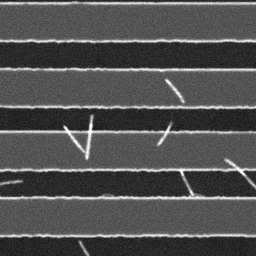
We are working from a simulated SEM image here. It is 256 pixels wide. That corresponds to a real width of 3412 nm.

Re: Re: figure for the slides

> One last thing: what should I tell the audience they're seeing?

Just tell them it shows lines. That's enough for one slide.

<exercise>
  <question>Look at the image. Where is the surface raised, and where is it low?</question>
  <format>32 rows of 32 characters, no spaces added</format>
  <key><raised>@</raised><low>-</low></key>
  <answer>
@@@@@@@@@@@@@@@@@@@@@@@@@@@@@@@@
@@@@@@@@@@@@@@@@@@@@@@@@@@@@@@@@
@@@@@@@@@@@@@@@@@@@@@@@@@@@@@@@@
@@@@@@@@@@@@@@@@@@@@@@@@@@@@@@@@
@@@@@@@@@@@@@@@@@@@@@@@@@@@@@@@@
--------------------------------
--------------------------------
--------------------------------
--------------------------------
@@@@@@@@@@@@@@@@@@@@@@@@@@@@@@@@
@@@@@@@@@@@@@@@@@@@@@@@@@@@@@@@@
@@@@@@@@@@@@@@@@@@@@@@@@@@@@@@@@
@@@@@@@@@@@@@@@@@@@@@@@@@@@@@@@@
--------@---@--@-@@-@@-@@@@@@@@@
--------------------------------
--------------------------------
@@@@@@@@@@-@@@----@-@@----------
@@@@@@@@@@@@@@@@@@@@@@@@@@@@@@@@
@@@@@@@@@@@@@@@@@@@@@@@@@@@@@@@@
@@@@@@@@@@@@@@@@@@@@@@@@@@@@@@@@
@@@@@@@@@@@@@@@@@@@@@@@@@@@@@@@@
--------------------------------
--------------------------------
--------------------------------
--------------------------------
@@@@@@@@@@@@@@@@@@@@@@@@@@@@@@@@
@@@@@@@@@@@@@@@@@@@@@@@@@@@@@@@@
@@@@@@@@@@@@@@@@@@@@@@@@@@@@@@@@
@@@@@@@@@@@@@@@@@@@@@@@@@@@@@@@@
@@@@-@@@@@@@@@-@@@----@@@@----@-
--------------------------------
--------------------------------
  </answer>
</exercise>